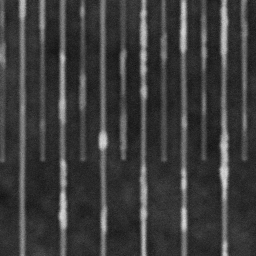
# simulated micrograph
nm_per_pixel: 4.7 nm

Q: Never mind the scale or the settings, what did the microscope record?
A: parallel lines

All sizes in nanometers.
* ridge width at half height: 17.6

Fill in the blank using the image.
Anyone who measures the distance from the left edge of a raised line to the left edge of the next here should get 0.0946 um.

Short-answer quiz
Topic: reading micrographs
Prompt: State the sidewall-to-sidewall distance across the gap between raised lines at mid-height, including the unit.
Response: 78.1 nm